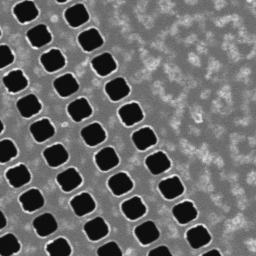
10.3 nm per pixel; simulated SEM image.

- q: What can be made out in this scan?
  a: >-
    a regular array of holes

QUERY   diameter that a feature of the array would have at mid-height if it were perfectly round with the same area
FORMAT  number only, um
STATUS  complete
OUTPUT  0.238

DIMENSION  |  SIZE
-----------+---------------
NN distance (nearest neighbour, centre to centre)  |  286 nanometres